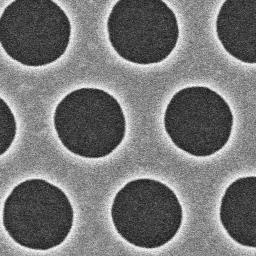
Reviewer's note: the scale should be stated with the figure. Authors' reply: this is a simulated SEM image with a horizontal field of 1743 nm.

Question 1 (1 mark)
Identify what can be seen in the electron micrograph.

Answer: holes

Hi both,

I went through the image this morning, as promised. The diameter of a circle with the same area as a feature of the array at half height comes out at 481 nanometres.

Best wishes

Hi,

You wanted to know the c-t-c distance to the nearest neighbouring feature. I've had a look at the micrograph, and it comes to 721 nanometers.